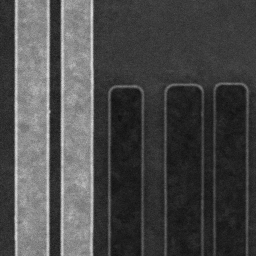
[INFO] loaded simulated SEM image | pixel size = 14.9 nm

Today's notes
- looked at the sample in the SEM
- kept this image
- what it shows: parallel lines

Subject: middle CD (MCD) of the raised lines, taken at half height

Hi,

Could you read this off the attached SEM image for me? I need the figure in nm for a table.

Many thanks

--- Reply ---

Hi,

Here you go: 479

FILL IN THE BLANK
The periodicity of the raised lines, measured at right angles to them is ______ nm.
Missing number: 718